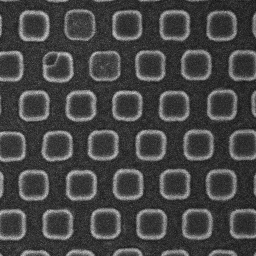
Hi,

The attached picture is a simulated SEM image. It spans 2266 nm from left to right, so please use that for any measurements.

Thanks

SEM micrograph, a regular array of raised bodies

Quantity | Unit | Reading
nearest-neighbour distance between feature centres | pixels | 45.3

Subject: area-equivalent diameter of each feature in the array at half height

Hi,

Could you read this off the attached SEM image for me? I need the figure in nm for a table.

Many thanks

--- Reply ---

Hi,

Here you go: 265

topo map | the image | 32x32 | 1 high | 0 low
00000000000000000000000000000000
00000000000000011000011000000000
00011100000000111100111100111000
00011100000000111100111100111000
00011100000000111000111000111000
00000000000000000000000000000000
00000000000000000000000011000011
11100001100111100111000111000111
11100011100111100111000111000111
11100011100011100111000111000111
00000000000000000000000000000000
00001000000000011000000000011000
00011100111100111100111000111100
00011100111100111100111000111000
00011100011100111000111000111000
00000000000000000000000000000000
00000001000011000011000011000011
11100011100111100111000111000111
11100111100111100111000111000111
11100011100111000111000111000111
00000000000000000000000000000000
00011000001000011000011000011000
00111100111100111100111100111000
00011100111100111100111100111000
00011100011100011000011000111000
00000000000000000000000000000000
11100011100011100011000111000111
11100011100011100111100111000111
11100011100011100111100111000111
11100011100011000011000111000111
00000000000000000000000000000000
00011000011000011000011000011000